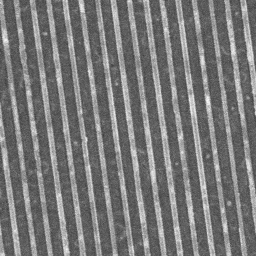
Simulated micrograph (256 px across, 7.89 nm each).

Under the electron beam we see parallel lines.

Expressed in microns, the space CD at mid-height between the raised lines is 0.0957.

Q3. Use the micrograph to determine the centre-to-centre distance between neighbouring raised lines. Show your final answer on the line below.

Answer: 0.127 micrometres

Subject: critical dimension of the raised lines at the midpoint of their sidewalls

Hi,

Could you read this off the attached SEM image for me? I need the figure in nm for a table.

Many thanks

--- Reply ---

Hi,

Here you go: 34.1